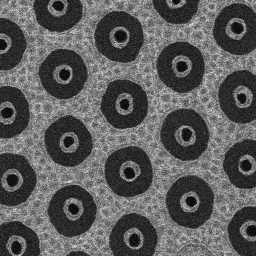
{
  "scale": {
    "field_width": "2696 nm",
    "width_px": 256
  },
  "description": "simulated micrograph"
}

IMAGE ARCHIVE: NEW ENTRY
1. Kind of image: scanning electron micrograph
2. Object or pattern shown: a regular array of ring-shaped grooves with a dot in the middle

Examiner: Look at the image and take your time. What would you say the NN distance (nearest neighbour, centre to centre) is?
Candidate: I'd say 709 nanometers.